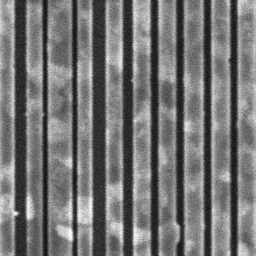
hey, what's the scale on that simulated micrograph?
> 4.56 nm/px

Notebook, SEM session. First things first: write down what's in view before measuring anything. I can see parallel lines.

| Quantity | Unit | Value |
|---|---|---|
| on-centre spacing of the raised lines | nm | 121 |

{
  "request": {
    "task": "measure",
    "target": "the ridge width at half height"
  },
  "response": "72.4 nanometers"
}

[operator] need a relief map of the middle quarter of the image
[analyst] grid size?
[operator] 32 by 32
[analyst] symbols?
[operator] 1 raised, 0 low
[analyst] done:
11001110000111000011100011110011
11001110000111000011100011110011
11001110000111000011100011110011
11001110000111000111100011110011
11001110000111000111100011110011
11001110000111000011100011110011
11001110000111000011100011110011
11001110000111000011100011110011
11001110000111000011100011110011
11001110000111000011100011110011
11001110000111000011100011110011
11001110000111000011100011110011
11001110000111000011100011110011
11001110000111000011100011110011
11001110000111000011100011110011
11001110000111000011100011110011
11001110000111000011100011110011
11001110000111000011100011110011
11001110000111000011100011110011
11001110000111000011100011110011
11001110000111000011100011110011
11001110000111000011100011110011
11001110000111000011100011110011
11001110000111000011100011110011
11001110000111000011100011110011
11001110000111000011100011110011
11001110000111000011100011110011
11001110000111000011100011110011
11001110000111000011100011110011
11001110000111000011100011110011
11001110000111000011100011110011
11001110000111000011100011110011